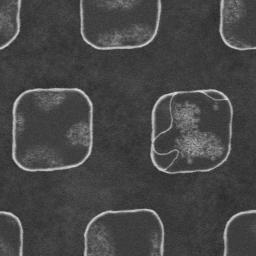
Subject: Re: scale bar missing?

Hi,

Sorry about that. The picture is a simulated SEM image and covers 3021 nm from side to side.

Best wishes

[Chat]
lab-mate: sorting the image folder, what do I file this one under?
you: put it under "raised bodies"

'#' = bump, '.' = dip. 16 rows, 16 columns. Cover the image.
#....#####....##
#....#####....##
#....####.....##
................
................
................
.#####....#.....
.#####....#.....
.#####..........
.#####..........
..##............
................
................
#.....####.....#
#....#####....##
#....#####....##